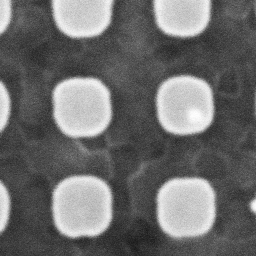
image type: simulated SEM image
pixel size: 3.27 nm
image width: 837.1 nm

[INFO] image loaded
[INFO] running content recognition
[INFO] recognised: raised bodies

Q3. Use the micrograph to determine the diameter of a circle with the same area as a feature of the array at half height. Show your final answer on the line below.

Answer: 193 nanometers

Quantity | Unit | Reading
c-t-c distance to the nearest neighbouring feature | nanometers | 330